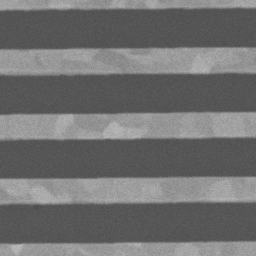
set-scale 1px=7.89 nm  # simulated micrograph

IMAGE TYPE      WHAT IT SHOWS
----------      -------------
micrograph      lines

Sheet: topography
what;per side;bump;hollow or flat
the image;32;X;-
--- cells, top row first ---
XXXXXXXXXXXXXXXXXXXXXXXXXXXXXXXX
--------------------------------
--------------------------------
--------------------------------
--------------------------------
--------------------------------
XXXXXXXXXXXXXXXXXXXXXXXXXXXXXXXX
XXXXXXXXXXXXXXXXXXXXXXXXXXXXXXXX
XXXXXXXXXXXXXXXXXXXXXXXXXXXXXXXX
--------------------------------
--------------------------------
--------------------------------
--------------------------------
--------------------------------
XXXXXXXXXXXXXXXXXXXXXXXXXXXXXXXX
XXXXXXXXXXXXXXXXXXXXXXXXXXXXXXXX
XXXXXXXXXXXXXXXXXXXXXXXXXXXXXXXX
--------------------------------
--------------------------------
--------------------------------
--------------------------------
--------------------------------
XXXXXXXXXXXXXXXXXXXXXXXXXXXXXXXX
XXXXXXXXXXXXXXXXXXXXXXXXXXXXXXXX
XXXXXXXXXXXXXXXXXXXXXXXXXXXXXXXX
--------------------------------
--------------------------------
--------------------------------
--------------------------------
--------------------------------
-----------------XXXXXXXXXXXXXXX
XXXXXXXXXXXXXXXXXXXXXXXXXXXXXXXX